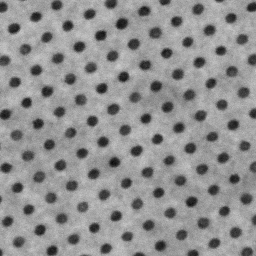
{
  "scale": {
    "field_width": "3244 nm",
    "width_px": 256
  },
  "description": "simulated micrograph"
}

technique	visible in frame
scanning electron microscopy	a regular array of holes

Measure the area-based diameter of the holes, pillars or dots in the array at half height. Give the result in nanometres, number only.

148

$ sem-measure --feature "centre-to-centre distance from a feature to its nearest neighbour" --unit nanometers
298